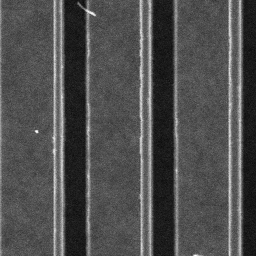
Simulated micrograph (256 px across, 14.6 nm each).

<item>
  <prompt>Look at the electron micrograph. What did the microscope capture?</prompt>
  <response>lines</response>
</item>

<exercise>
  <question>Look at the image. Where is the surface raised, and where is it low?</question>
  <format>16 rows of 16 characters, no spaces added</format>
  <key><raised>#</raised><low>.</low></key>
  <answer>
####.####..####.
####..###..####.
####..###..####.
####..###..####.
####..###..####.
####..###..####.
####..###..####.
####..###..####.
####..###..####.
####..###..####.
####..###..####.
####..###..####.
####..###..####.
####..###..####.
####..###..####.
####..###..####.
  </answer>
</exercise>